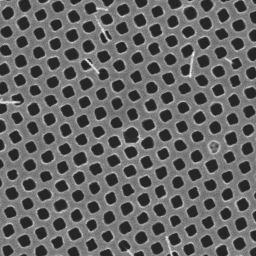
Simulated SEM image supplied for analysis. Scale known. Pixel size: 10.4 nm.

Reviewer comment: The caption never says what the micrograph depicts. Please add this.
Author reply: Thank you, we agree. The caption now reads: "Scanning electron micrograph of a regular array of holes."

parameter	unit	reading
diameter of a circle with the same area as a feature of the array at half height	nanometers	121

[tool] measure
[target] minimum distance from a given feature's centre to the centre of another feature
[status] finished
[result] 190 nanometers